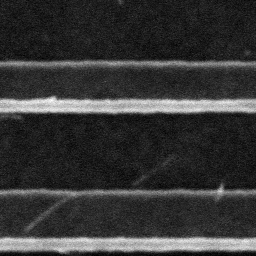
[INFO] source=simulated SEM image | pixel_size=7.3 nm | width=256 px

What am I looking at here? lines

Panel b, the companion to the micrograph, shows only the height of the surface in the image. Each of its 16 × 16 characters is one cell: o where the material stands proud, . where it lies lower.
................
................
................
................
oooooooooooooooo
oooooooooooooooo
oooooooooooooooo
................
................
................
................
................
oooooooooooooooo
oooooooooooooooo
oooooooooooooooo
oooooooooooooooo